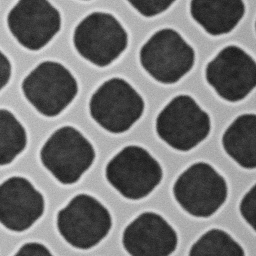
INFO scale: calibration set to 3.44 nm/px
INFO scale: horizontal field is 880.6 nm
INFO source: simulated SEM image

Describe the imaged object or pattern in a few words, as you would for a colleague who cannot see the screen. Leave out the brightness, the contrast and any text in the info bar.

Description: a regular array of holes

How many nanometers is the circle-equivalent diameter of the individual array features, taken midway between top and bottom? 183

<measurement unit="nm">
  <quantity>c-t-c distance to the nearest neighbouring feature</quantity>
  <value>237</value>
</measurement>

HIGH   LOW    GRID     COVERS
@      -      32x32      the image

@@----@@@@@@@@@@------@@-------@
@------@@@@@-@@@@---@@@@-------@
@-------@@-----@@@@@@@@@------@@
@-------@------@@@@@@@@@@----@@@
@@-----@@-------@@@----@@@@@@@@@
@@@---@@@-------@@-----@@@@@@@@@
@@@@@@@@@@-----@@@------@@@----@
-@@@@@@@@@@---@@@@------@@@-----
-@@@----@@@@@@@@@@------@@------
-@@------@@@@@@@@@@----@@@------
-@@-------@@@---@@@@@@@@@@------
@@@-------@@-----@@@@@@@@@@----@
@@@@-----@@-------@@@---@@@@--@@
@@@@----@@@-------@@@----@@@@@@@
--@@@@-@@@@-------@@------@@@@--
---@@@@@@@@@-----@@-------@@@---
---@@@@---@@@@--@@@@------@@----
---@@@-----@@@@@@@@@-----@@@----
---@@-------@@@@--@@@@--@@@@----
--@@@-------@@-----@@@@@@@@@@---
-@@@@------@@-------@@@@--@@@@--
@@@@@@-----@@-------@@@----@@@@@
@---@@@---@@@-------@@------@@@@
----@@@@@@@@@@-----@@@------@@@-
-----@@@@@-@@@@---@@@@------@@@-
------@@@----@@@@@@@@@------@@--
-----@@-------@@@@-@@@@----@@@--
-----@@-------@@@----@@@@@@@@@@-
@---@@@-------@@------@@@@@@@@@@
@@@@@@@@-----@@-------@@@----@@@
@@@--@@@@---@@@-------@@------@@
@@----@@@@@@@@@@------@@-------@